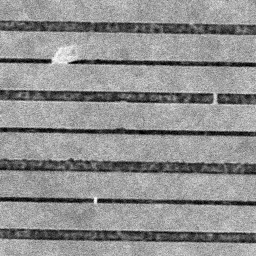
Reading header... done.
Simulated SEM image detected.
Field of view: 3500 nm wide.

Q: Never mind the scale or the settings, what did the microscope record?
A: parallel lines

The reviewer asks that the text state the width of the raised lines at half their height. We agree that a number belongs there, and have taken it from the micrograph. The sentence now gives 366 nanometers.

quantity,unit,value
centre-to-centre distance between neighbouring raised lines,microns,0.466